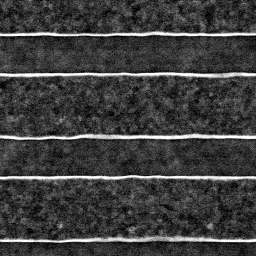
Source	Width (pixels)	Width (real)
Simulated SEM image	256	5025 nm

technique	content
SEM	wiring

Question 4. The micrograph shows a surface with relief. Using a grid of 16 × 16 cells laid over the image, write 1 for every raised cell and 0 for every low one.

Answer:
1111111111111111
1111111111111111
0000000000000000
0000000000000000
0000000000000000
1111111111111111
1111111111111111
1111111111111111
1111111111111111
0000000000000000
0000000000000000
1111111111111111
1111111111111111
1111111111111111
1111111111111111
0000000000000000